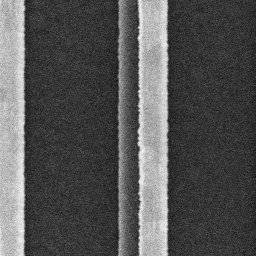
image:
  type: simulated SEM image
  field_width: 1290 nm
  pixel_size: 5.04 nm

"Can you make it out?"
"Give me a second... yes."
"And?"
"lines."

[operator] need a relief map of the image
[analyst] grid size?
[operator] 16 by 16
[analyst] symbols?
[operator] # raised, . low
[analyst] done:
##.....###......
##.....###......
##.....###......
##.....###......
#......###......
##.....###......
##.....###......
##.....###......
##.....###......
##.....###......
#......###......
##.....###......
##.....###......
#......###......
##.....###......
##.....###......